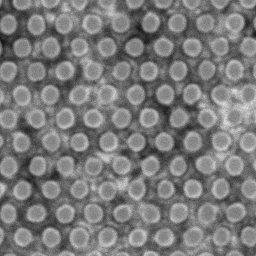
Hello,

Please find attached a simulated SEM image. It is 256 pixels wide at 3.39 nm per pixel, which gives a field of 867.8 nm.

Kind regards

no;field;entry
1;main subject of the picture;a regular array of raised bodies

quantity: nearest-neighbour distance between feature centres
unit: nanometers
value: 91.3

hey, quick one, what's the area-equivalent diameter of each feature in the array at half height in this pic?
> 59.8 nanometers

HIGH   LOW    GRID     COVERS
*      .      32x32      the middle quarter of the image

**...****....***...****....***..
**...*****..****...****....****.
**...****...****...****....***..
*.....**.....**.....***....***..
................................
..........**......*......*.....*
..****...****...****...****...**
..****...****...****...****...**
..****...***....****...****...**
..***....***.....**.....***....*
................................
*.....**.....***....**..........
**....***....***...****....***..
**...****...*****..****....****.
**...****...****...****....****.
**....**.....***...........**...
................................
..........**.....**.....**......
..****...****...****...****....*
..****...****...****...****...**
..****...****...****...****...**
...**............**.....**.....*
................................
**.....*.....**......**.........
**....***....***....****...***..
**...*****..*****...****...****.
**...****....***....***....***..
......***....**.....**.....***..
................................
...**.....**.....**......*.....*
..****...****...****....***...**
..****...****...****....***...**